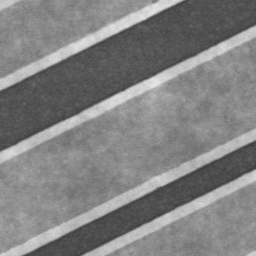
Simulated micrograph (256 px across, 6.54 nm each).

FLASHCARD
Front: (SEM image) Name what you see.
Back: one or a few lines or trenches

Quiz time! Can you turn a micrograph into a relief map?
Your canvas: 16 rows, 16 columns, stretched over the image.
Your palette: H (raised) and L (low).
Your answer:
HHHHHHHHHHLLLLLL
HHHHHHHHLLLLLLLL
HHHHHHLLLLLLLLLH
HHHHLLLLLLLLLHHH
HHLLLLLLLLLHHHHH
LLLLLLLLLHHHHHHH
LLLLLLLHHHHHHHHH
LLLLLHHHHHHHHHHH
LLLHHHHHHHHHHHHH
LHHHHHHHHHHHHHLL
HHHHHHHHHHHHLLLL
HHHHHHHHHHLLLLLH
HHHHHHHHLLLLLHHH
HHHHHHLLLLLHHHHH
HHHHLLLLLHHHHHHH
HHLLLLLHHHHHHHHH